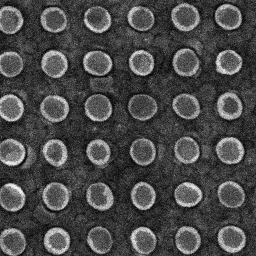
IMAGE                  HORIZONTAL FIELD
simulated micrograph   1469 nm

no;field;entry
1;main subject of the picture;a regular array of raised bodies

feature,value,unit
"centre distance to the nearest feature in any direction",249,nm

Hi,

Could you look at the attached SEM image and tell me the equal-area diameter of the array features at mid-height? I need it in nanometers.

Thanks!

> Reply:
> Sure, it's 146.